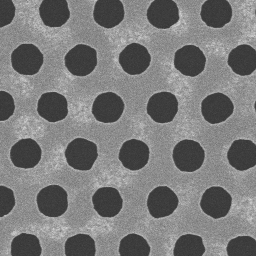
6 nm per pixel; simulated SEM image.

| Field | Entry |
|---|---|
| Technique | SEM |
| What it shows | a regular array of holes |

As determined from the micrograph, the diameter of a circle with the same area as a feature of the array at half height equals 0.189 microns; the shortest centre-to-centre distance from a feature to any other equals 323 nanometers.